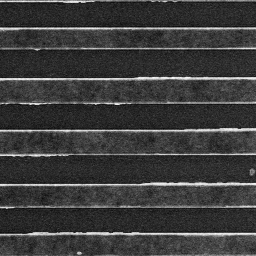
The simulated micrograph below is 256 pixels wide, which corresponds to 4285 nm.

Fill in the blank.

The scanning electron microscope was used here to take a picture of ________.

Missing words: lines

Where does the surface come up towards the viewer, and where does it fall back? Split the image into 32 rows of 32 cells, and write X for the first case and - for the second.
--------------------------------
--------------------------------
--------------------------------
--------------------------------
XXXXXXXXXXXXXXXXXXXXXXXXXXXXXXXX
XXXXXXXXXXXXXXXXXXXXXXXXXXXXXXXX
--------------------------------
--------------------------------
--------------------------------
--------------------------------
XXXXXXXXXXXXXXXXXXXXXXXXXXXXXXXX
XXXXXXXXXXXXXXXXXXXXXXXXXXXXXXXX
XXXXXXXXXXXXXXXXXXXXXXXXXXXXXXXX
--------------------------------
--------------------------------
--------------------------------
XXXXXXXXXXXXXXXXXXXXXXXXXXXXXXXX
XXXXXXXXXXXXXXXXXXXXXXXXXXXXXXXX
XXXXXXXXXXXXXXXXXXXXXXXXXXXXXXXX
--------------------------------
--------------------------------
--------------------------------
--------------------------------
XXXXXXXXXXXXXXXXXXXXXXXXXXXXXXXX
XXXXXXXXXXXXXXXXXXXXXXXXXXXXXXXX
XXXXXXXXXXXXXXXXXXXXXXXXXXXXXXXX
--------------------------------
--------------------------------
--------------------------------
XXXXXXXXXXXXXXXXXXXXXXXXXXXXXXXX
XXXXXXXXXXXXXXXXXXXXXXXXXXXXXXXX
XXXXXXXXXXXXXXXXXXXXXXXXXXXXXXXX